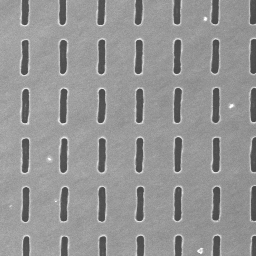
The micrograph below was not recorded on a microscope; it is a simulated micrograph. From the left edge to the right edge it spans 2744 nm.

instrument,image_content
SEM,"a regular array of holes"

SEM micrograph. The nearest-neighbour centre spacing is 0.406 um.